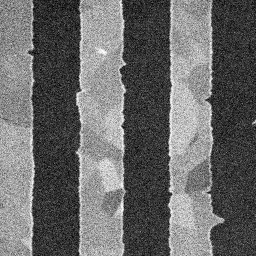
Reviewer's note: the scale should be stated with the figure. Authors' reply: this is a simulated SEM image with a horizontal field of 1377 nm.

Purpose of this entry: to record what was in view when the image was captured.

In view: one or a few lines or trenches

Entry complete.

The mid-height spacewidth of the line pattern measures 257 nm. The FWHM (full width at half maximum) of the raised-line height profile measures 222 nanometers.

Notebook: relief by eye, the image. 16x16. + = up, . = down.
++...+++...++...
++...+++...++...
++...+++...++...
++...+++...++...
++...+++...++...
++...+++...++...
++...+++...++...
++...+++...++...
++...+++...++...
++...+++...++...
++...+++...++...
++...+++...++...
++...+++...++...
++...+++...+++..
++...+++...++...
++...+++...++...